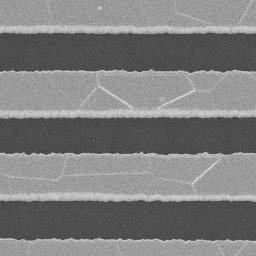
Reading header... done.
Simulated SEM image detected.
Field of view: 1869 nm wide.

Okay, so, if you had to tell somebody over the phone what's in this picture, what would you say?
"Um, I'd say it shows lines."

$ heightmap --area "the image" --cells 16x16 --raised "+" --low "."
++++++++++++++++
++++++++++++++++
................
................
++++++++++++++++
++++++++++++++++
++++++++++++++++
................
................
................
++++++++++++++++
++++++++++++++++
................
................
................
++++++++++++++++